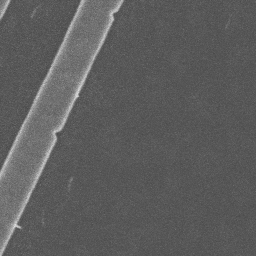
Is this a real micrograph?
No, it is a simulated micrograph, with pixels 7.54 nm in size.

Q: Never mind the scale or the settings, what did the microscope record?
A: one or a few lines or trenches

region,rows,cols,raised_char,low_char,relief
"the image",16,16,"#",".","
.....##.........
....###.........
....##..........
....##..........
...###..........
...##...........
..###...........
..##............
.###............
.##.............
###.............
##..............
##..............
#...............
#...............
................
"